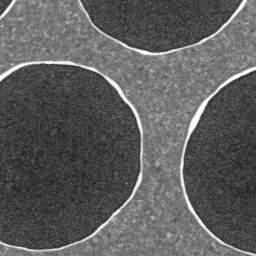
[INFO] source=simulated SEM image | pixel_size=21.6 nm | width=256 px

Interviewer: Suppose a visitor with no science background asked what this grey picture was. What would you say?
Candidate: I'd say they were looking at holes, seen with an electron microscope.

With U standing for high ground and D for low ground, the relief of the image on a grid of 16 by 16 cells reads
UUUUUDDDDDDDDDDU
UUUUUUDDDDDDDDUU
UUUUUUUDDDDDDUUU
UUUUUUUUUUUUUUUU
UDDDDDUUUUUUUUUU
DDDDDDDUUUUUUUDD
DDDDDDDDUUUUUDDD
DDDDDDDDDUUUDDDD
DDDDDDDDDUUUDDDD
DDDDDDDDDUUUDDDD
DDDDDDDDDUUDDDDD
DDDDDDDDDUUDDDDD
DDDDDDDDUUUUDDDD
DDDDDDDUUUUUDDDD
DDDDDDUUUUUUUDDD
UUDDUUUUUUUUUUUD